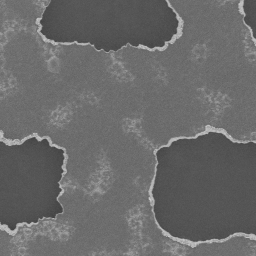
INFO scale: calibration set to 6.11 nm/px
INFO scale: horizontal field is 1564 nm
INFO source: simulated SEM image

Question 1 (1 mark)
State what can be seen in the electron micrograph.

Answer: holes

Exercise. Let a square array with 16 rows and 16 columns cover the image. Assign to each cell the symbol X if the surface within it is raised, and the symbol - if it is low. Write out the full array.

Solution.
XXX--------XXXX-
XXX--------XXXX-
XXX--------XXXXX
XXXXXXXXXXXXXXXX
XXXXXXXXXXXXXXXX
XXXXXXXXXXXXXXXX
XXXXXXXXXXXXXXXX
XXXXXXXXXXXXXXXX
XXXXXXXXXXXX--XX
----XXXXXX------
----XXXXXX------
----XXXXXX------
----XXXXXX------
---XXXXXXX------
XXXXXXXXXX------
XXXXXXXXXXXXXXXX